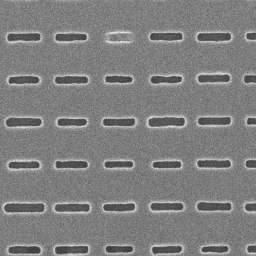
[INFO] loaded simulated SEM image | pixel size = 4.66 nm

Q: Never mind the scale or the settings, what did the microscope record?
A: a regular array of holes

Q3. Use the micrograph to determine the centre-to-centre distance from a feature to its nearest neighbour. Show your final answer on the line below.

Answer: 198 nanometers